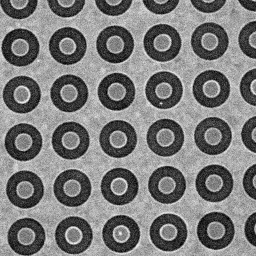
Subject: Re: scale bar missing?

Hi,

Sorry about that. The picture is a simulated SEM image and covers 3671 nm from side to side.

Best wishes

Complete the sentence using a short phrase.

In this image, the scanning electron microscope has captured an array of small figures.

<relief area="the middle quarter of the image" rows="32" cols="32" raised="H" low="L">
HHHHHHHHHHHHHHHHHHHHHHHHHHHHHHHH
HHHHHHHHHHHHHHHHHHHHHHHHHHHHHHHH
HLHHHHHHHHHLLLLHHHHHHHLLLLLLHHHH
LLLLHHHHHHLLLLLLLHHHHLLLLLLLLHHH
LLLLLHHHHLLLLLLLLHHHHLLLLLLLLHHH
HHLLLLHHHLLLHHHLLLHHLLLHHHLLLLHH
HHHLLLHHLLLHHHHLLLHHLLLHHHHLLLHH
HHHLLLHHLLLHHHHLLLHHLLLHHHHLLLHH
HHHLLLHHHLLLHHHLLLHHHLLLHLLLLHHH
LLLLLLHHHLLLLLLLLHHHHLLLLLLLLHHH
LLLLLHHHHHLLLLLLHHHHHHLLLLLLHHHH
LLLLHHHHHHHLLLLHHHHHHHHHHHHHHHHH
HHHHHHHHHHHHHHHHHHHHHHHHHHHHHHHH
HHHHHHHHHHHHHHHHHHHHHHHHHLHHHHHH
LLLHHHHHHHHLLLLLHHHHHHLLLLLLHHHH
LLLLLHHHHHLLLLLLLHHHHLLLLLLLLHHH
LLLLLLHHHLLLLLLLLLHHHLLLLHLLLLHH
HHHLLLHHHLLLHHHLLLHHHLLHHHHLLLHH
HHHHLLHHHLLLHHHHLLLHLLLHHHHLLLHH
HHHHLLLHHLLLHHHLLLHHHLLLHHHLLLHH
HHHLLLHHHLLLHHHLLLHHHLLLLLLLLLHH
LLLLLLHHHHLLLLLLLLHHHHLLLLLLLHHH
LLLLLHHHHHLLLLLLLHHHHHHLLLLLHHHH
LLLLHHHHHHHHLLHHHHHHHHHHHHHHHHHH
HHHHHHHHHHHHHHHHHHHHHHHHHHHHHHHH
HHHHHHHHHHHHHHHHHHHHHHHHHLLHHHHH
LLLLHHHHHHHLLLLLHHHHHHHLLLLLLHHH
LLLLLHHHHHLLLLLLLLHHHHLLLLLLLLHH
LLLLLLHHHLLLLLLLLLHHHLLLLHHLLLHH
LHHLLLLHHLLLHHHLLLLHHLLLHHHHLLLH
HHHHLLLHHLLLHHHHLLLHHLLLHHHHLLLH
HHHHLLLHHLLLHHHLLLLHHLLLHHHLLLHH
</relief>